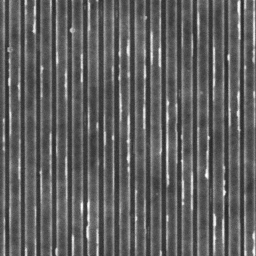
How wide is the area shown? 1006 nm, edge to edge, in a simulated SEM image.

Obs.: parallel lines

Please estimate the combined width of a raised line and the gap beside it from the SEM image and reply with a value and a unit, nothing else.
61.5 nm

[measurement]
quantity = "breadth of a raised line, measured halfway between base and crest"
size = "43.2 nm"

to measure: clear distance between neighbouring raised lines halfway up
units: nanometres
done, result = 18.2